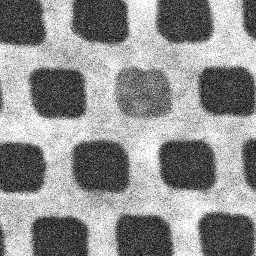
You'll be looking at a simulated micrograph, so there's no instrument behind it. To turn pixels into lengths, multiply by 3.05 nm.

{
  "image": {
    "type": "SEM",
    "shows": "holes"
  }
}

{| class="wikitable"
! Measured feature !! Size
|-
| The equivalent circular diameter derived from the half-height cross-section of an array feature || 175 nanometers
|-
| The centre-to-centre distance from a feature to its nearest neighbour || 258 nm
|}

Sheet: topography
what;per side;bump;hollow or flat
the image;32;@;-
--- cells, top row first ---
-----@@@@-------@@@@------@@@@--
-----@@@@-------@@@@------@@@@--
-----@@@@-------@@@--------@@@--
------@@@-------@@@--------@@@--
------@@@@------@@@@-------@@@@-
@----@@@@@@@@--@@@@@@@@@@@@@@@@@
@@@@@@@@@@@@@@@@@@@@@@@@@@@@@@@@
@@@@@@@@@@@@@@@@@@@@@@@@@@@@@@@@
@@@@@-@@@@@@@@@@-@@@@@@@@@-----@
@@@@-------@@@-------@@@@-------
@@@@-------@@@-------@@@@-------
@@@@-------@@@-------@@@@-------
@@@@-------@@@--------@@@-------
@@@@-------@@@@-------@@@-------
@@@@@-----@@@@@@-----@@@@@@@@@-@
@@@@@@@@@@@@@@@@@@@@@@@@@@@@@@@@
@@@@@@@@@@@@@@@@@@@@@@@@@@@@@@@@
@@@@@@@@@@@@-@@@@@@@@@@@-@@@@@@-
-----@@@@------@@@@@------@@@@--
------@@@-------@@@@-------@@@--
------@@@-------@@@@-------@@@--
------@@@-------@@@@-------@@@--
------@@@-------@@@@-------@@@@-
-----@@@@@------@@@@@-----@@@@@-
@@@@@@@@@@@@@@@@@@@@@@@@@@@@@@@@
@@@@@@@@@@@@@@@@@@@@@@@@@@@@@@@@
@@@@@@@@@@@@@@@@@@@@@@@@@@--@@@@
@@@@------@@@@@------@@@@------@
@@@@-------@@@-------@@@@-------
@@@@-------@@@@------@@@@-------
-@@@-------@@@@-------@@@-------
-@@@-------@@@@-------@@@-------